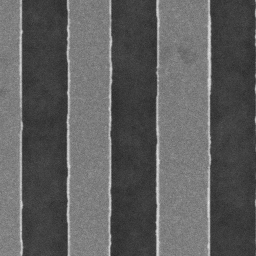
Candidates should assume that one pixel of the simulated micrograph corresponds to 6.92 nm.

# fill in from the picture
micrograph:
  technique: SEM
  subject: lines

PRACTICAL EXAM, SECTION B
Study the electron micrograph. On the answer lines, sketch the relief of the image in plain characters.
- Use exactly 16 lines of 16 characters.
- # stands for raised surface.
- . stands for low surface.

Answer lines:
#...###...###...
#...###...###...
#...###...###...
#...###...###...
#...###...###...
#...###...###...
#...###...###...
#...###...###...
#...###...###...
#...###...###...
#...###...###...
#...###...###...
#...###...###...
#...###...###...
#...###...###...
#...###...###...